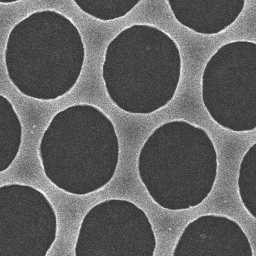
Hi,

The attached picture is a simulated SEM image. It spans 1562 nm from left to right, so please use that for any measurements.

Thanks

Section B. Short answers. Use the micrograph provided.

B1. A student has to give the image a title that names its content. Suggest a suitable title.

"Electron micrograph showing holes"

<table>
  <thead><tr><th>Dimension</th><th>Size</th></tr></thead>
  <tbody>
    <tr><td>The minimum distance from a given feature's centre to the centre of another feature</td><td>603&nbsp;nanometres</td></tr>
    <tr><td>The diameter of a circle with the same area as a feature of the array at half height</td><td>507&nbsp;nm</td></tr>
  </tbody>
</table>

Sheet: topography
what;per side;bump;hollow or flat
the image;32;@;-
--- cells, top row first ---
@@@@@@@@@@-------@@@@---------@@
@@@@@--@@@@-----@@@@@@--------@@
@@@------@@@@@@@@@@@@@-------@@@
@@--------@@@@@@---@@@@@----@@@@
@---------@@@@@------@@@@@@@@@@@
@---------@@@@--------@@@@@@----
@---------@@@---------@@@@@-----
@---------@@@----------@@@------
@---------@@@----------@@@------
@---------@@@---------@@@-------
@@-------@@@@---------@@@-------
@@@-----@@@@@---------@@@-------
-@@@@@@@@@@@@@-------@@@@-------
--@@@@@@----@@@-----@@@@@@------
--@@@@@------@@@@@@@@@@@@@------
---@@@--------@@@@@@@---@@@-----
---@@@--------@@@@@-------@@@@@@
---@@----------@@@--------@@@@@@
--@@@----------@@@---------@@@@-
--@@@----------@@----------@@@@-
-@@@@----------@@----------@@@--
@@@@@@--------@@@----------@@@--
@@@@@@--------@@@@---------@@@--
----@@@@----@@@@@@--------@@@@--
------@@@@@@@@@@@@@-------@@@@--
------@@@@@@-----@@@-----@@@@@--
-------@@@@-------@@@@@@@@@@@@@-
-------@@@---------@@@@@-----@@@
-------@@@---------@@@@-------@@
-------@@@---------@@@@--------@
------@@@@---------@@@---------@
------@@@----------@@@---------@